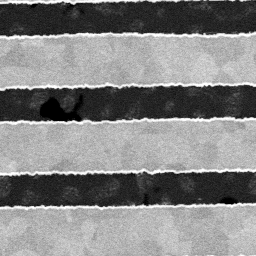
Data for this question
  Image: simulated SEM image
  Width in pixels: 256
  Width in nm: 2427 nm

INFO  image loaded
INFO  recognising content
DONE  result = one or a few lines or trenches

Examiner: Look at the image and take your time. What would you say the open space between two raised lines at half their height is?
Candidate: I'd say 332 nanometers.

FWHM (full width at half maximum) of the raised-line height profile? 480 nm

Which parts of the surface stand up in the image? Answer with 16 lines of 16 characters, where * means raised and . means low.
................
................
****************
****************
****************
*...............
................
..........**.***
****************
****************
****************
................
................
****************
****************
****************